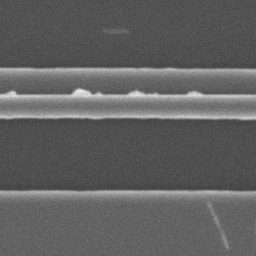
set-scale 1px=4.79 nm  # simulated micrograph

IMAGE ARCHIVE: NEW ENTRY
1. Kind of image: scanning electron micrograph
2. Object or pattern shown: lines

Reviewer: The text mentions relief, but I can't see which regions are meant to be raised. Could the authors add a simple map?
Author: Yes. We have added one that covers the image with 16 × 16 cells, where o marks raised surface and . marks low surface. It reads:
................
................
................
................
oooooooooooooooo
oooooooooooooooo
oooooooooooooooo
................
................
................
................
................
oooooooooooooooo
oooooooooooooooo
oooooooooooooooo
oooooooooooooooo